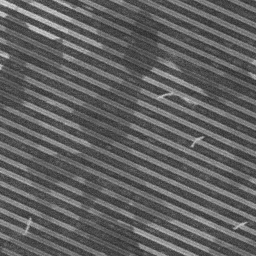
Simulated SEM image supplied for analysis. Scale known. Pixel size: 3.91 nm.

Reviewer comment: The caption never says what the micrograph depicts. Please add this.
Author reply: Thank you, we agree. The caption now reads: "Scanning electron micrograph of parallel lines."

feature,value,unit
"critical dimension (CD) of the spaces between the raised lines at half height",0.0304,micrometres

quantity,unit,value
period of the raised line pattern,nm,46.4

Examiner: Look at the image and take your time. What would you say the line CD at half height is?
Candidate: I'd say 16.9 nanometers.